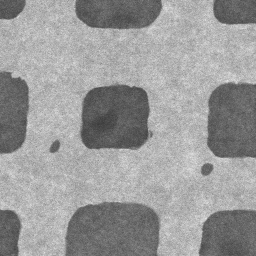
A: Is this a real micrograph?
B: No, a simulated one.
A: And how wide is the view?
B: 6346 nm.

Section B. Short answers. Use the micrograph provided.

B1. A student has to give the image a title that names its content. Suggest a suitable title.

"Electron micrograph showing holes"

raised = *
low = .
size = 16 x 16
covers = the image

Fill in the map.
.****.....***...
*****....*****.*
****************
****************
****************
..****...*****..
..***....****...
..***....****...
..***....****...
.************...
****************
****************
****************
.****.....***...
.***......***...
.***......**....